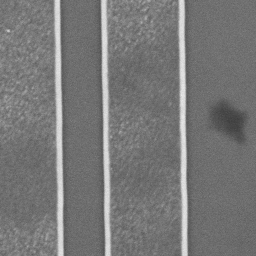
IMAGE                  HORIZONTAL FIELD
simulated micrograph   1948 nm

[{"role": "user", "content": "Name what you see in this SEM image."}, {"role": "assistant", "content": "wiring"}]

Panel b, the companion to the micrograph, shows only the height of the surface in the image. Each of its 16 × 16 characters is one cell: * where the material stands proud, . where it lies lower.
****...****.....
****...****.....
****...****.....
****...****.....
****...****.....
****...****.....
****...****.....
****...****.....
****...****.....
****...****.....
****...****.....
****...****.....
****...****.....
****...****.....
****...****.....
****...*****....